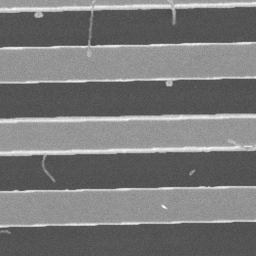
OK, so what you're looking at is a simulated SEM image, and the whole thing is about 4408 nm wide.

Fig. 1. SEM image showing lines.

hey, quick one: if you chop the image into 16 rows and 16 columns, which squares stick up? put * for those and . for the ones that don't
********..*.....
................
................
****************
****************
................
................
.***************
****************
*******.........
................
................
****************
****************
................
................